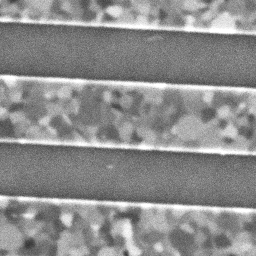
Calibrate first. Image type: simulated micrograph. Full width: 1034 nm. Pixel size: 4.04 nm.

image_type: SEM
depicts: one or a few lines or trenches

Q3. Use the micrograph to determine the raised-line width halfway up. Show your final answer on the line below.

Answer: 260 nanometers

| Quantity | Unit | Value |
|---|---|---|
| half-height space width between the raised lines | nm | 225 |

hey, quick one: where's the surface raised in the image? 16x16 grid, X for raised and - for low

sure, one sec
XXXXXXXXXXXXXXXX
----XXXXXXXXXXXX
----------------
----------------
----------------
XXXXXXXXXXXXXXX-
XXXXXXXXXXXXXXXX
XXXXXXXXXXXXXXXX
XXXXXXXXXXXXXXXX
-------------XXX
----------------
----------------
XXXX------------
XXXXXXXXXXXXXXXX
XXXXXXXXXXXXXXXX
XXXXXXXXXXXXXXXX